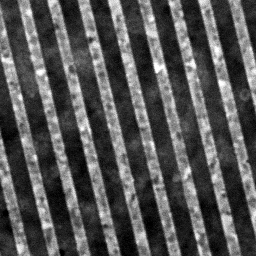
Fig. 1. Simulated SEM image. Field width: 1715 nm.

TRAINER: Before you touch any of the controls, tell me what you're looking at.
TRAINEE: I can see parallel lines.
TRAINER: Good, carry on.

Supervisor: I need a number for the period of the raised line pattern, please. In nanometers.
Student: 196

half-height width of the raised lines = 10.3 px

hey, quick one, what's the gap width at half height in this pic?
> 130 nm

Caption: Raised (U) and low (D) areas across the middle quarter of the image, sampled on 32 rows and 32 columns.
UUUDDDDDUUDDDDDUUUDDDDDUUDDDDDUU
UUUDDDDDUUDDDDDUUUDDDDDUUUDDDDUU
UUUDDDDDUUUDDDDDUUDDDDDUUUDDDDDU
DUUDDDDDUUUDDDDDUUDDDDDUUUDDDDDU
DUUUDDDDDUUDDDDDUUUDDDDDUUDDDDDU
DUUUDDDDDUUDDDDDUUUDDDDDUUUDDDDU
DUUUDDDDDUUUDDDDDUUDDDDDUUUDDDDD
DDUUDDDDDUUUDDDDDUUDDDDDUUUDDDDD
DDUUUDDDDDUUDDDDDUUUDDDDDUUDDDDD
DDUUUDDDDDUUDDDDDUUUDDDDDUUDDDDD
DDUUUDDDDDUUUDDDDDUUDDDDDUUUDDDD
DDDUUDDDDDUUUDDDDDUUDDDDDUUUDDDD
DDDUUDDDDDDUUDDDDDUUUDDDDDUUDDDD
DDDUUUDDDDDUUDDDDDUUUDDDDDUUDDDD
DDDUUUDDDDDUUUDDDDUUUDDDDDUUUDDD
DDDDUUDDDDDUUUDDDDDUUDDDDDUUUDUD
DDDDUUDDDDDUUUDDDDDUUUDDDDDUUDDD
DDDDUUUDDDDDUUDDDDDUUUDDDDDUUDDD
DDDDUUUDDDDDUUUDDDDUUUDDDDDUUUDD
DDDDDUUDDDDDUUUDDDDDUUDDDDDUUUDD
DDDDDUUDDDDDUUUDDDDDUUDDDDDDUUDD
DDDDDUUUDDDDDUUDDDDDUUUDDDDDUUDD
DDDDDUUUDDDDDUUUDDDDUUUDDDDDUUUD
UDDDDDUUDDDDDUUUDDDDDUUDDDDDUUUD
UDDDDDUUDDDDDUUUDDDDDUUDDDDDDUUD
UDDDDDUUUDDDDDUUDDDDDUUUDDDDDUUD
UDDDDDUUUDDDDDUUDDDDDUUUDDDDDUUU
UUDDDDDUUDDDDDUUUDDDDDUUDDDDDUUU
UUDDDDDUUDDDDDUUUDDDDDUUDDDUUUUU
UUDDDDDUUUDDDDDUUDDDDDUUUDDDDDUU
UUDDDDDUUUDDDDDUUDDDDDUUUDDDDDUU
UUUDDDDUUUDDDDDUUUDDDDDUUDDDDDUU